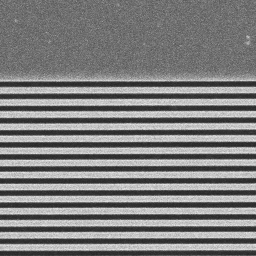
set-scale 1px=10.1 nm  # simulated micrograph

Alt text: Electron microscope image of parallel lines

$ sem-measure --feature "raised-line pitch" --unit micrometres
0.122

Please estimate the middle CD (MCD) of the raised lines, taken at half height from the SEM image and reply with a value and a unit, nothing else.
71.8 nm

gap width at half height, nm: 54.2